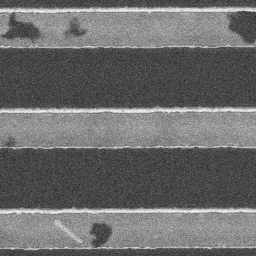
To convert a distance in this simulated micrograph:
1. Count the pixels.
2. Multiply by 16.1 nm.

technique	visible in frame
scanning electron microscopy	lines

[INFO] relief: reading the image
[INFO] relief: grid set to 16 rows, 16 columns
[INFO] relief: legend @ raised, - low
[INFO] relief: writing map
@@@@@@@@@@@@@@@@
----------------
----------------
@@@@@@@@@@@@@@@@
@@@@@@@@@@@@@@@@
@@@@@@@@@@@@@@@@
@@@@@@@@@@@@@@@@
----------------
----------------
@@@@@@@@@@@@@@@@
@@@@@@@@@@@@@@@@
@@@@@@@@@@@@@@@@
@@@@@@@@@@@@@@@@
----------------
----------------
----@-@@@@@@@@@@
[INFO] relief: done